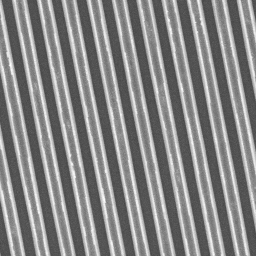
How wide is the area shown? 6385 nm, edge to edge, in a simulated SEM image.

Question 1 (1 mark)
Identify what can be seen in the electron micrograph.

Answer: parallel lines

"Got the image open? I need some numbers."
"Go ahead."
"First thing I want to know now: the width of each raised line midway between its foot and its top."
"11.9 pixels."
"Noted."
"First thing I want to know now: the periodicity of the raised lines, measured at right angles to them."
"612 nm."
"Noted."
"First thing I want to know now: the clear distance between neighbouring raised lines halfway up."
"318 nm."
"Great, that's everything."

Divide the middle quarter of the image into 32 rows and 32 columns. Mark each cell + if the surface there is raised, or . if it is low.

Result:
...+++...+++...+++....+++...+++.
...+++....++....+++...+++...+++.
...+++....+++...+++...+++...+++.
....++....+++...+++...+++....++.
....+++...+++...+++...+++....+++
+...+++...+++...+++....+++...+++
+...+++...+++....+++...+++...+++
+...+++....++....+++...+++...+++
+....++....+++...+++...+++....++
+....++....+++...+++...+++....++
++...+++...+++...+++....++....++
++...+++...+++....++....+++...++
++...+++....++....+++...+++...++
++....++....+++...+++...+++....+
++....++....+++...+++...+++....+
+++...+++...+++...+++....++....+
+++...+++...+++...+++....+++...+
+++...+++....++....+++...+++...+
+++...+++....+++...+++...+++...+
+++....++....+++...+++....++....
.+++...+++...+++...+++....++....
.+++...+++...+++...+++....++....
.+++...+++....++....+++...+++...
.+++...+++....++....+++...+++...
.+++....++....+++...+++....++...
..++....+++...+++...+++....++...
..+++...+++...+++....++....+++..
..+++...+++....++....+++...+++..
..+++...+++....++....+++...+++..
..+++....++....+++...+++....++..
...++....+++...+++...+++....++..
...+++...+++...+++....++....+++.